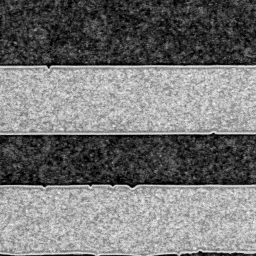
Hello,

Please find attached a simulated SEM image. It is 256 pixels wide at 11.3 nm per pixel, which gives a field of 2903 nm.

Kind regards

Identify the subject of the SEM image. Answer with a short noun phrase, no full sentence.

one or a few lines or trenches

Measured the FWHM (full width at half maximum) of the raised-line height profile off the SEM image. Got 764 nanometres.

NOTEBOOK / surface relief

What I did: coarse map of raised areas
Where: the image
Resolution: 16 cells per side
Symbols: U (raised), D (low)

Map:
DDDDDDDDDDDDDDDD
DDDDDDDDDDDDDDDD
DDDDDDDDDDDDDDDD
DDDDDDDDDDDDDDDD
UUUUUUUUUUUUUUUU
UUUUUUUUUUUUUUUU
UUUUUUUUUUUUUUUU
UUUUUUUUUUUUUUUU
DDDDDDDDDDDDDDDD
DDDDDDDDDDDDDDDD
DDDDDDDDDDDDDDDD
DDDDDDDDDDDDDDDD
UUUUUUUUUUUUUUUU
UUUUUUUUUUUUUUUU
UUUUUUUUUUUUUUUU
UUUUUUUUUUUUUUUU